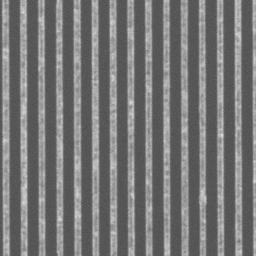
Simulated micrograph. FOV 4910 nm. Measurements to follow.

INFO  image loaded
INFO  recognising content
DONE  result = parallel lines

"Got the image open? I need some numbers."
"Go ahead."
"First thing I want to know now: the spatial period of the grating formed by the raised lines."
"343 nanometers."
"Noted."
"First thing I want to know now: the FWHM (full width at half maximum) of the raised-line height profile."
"101 nm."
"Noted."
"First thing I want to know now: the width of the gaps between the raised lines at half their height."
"249 nm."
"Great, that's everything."